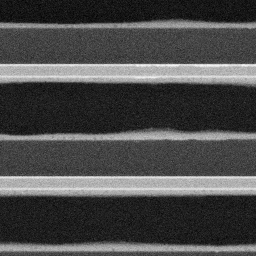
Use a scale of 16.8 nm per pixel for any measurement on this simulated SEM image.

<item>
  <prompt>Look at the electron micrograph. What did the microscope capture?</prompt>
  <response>lines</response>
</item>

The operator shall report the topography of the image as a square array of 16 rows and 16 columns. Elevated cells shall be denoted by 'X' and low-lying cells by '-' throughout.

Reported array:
----------------
----------------
XXXXXXXXXXXXXXXX
XXXXXXXXXXXXXXXX
XXXXXXXXXXXXXXXX
----------------
----------------
----------------
----------------
XXXXXXXXXXXXXXXX
XXXXXXXXXXXXXXXX
XXXXXXXXXXXXXXXX
----------------
----------------
----------------
----------------